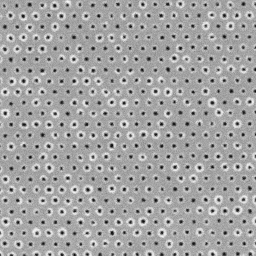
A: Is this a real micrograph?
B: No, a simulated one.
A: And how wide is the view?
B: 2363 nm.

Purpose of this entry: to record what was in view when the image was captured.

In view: a regular array of holes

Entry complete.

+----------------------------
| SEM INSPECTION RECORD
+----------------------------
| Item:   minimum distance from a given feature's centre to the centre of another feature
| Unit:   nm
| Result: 109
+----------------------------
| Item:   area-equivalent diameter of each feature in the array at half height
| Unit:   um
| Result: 0.0375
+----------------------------